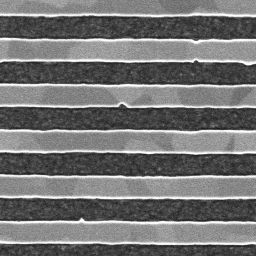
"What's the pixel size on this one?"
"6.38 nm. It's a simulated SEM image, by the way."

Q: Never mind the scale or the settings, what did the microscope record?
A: parallel lines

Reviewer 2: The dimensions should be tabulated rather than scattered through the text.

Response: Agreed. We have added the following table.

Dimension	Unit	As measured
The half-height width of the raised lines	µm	0.143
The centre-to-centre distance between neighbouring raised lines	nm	291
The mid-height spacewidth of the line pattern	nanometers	149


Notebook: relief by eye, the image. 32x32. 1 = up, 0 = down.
11111111111111111111111111111111
11111111111111111111111111111111
00000000000000000000000000000000
00000000000000000000000000000000
00000000000000000000000000000000
11111111111111111111111111111111
11111111111111111111111111111111
11111111111111111111111111111111
00000000000000000000000000000000
00000000000000000000000000000000
11000110000000000000000000000000
11111111111111111111111111111111
11111111111111111111111111111111
00000000000000000000000000001100
00000000000000000000000000000000
00000000000000000000000000000000
11111111111111111111111011111111
11111111111111111111111111111111
11111111111111111111111111111111
00000000000000000000000000000000
00000000000000000000000000000000
00000000000000000000000000000000
11111111111111111111111111111111
11111111111111111111111111111111
11111111111111111111111111111111
00000000000000000000000000000000
00000000000000000000000000000000
00000000000000000000000000000000
11111111111111111111111111111111
11111111111111111111111111111111
00000000000000000000111111111110
00000000000000000000000000000000